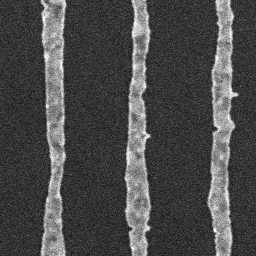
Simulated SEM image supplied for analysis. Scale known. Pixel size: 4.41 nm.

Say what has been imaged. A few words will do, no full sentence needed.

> one or a few lines or trenches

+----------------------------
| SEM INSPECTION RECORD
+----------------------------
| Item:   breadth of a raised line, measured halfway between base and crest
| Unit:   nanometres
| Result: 69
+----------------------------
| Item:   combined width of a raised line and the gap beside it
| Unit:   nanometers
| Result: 370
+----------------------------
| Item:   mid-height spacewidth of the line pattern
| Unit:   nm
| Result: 302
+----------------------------